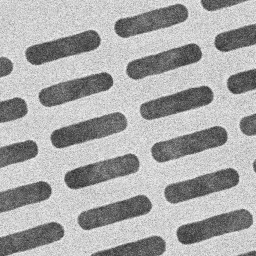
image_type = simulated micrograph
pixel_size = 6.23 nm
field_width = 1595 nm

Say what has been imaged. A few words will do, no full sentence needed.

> a regular array of holes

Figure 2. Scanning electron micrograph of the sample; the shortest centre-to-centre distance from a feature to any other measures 268 nanometres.